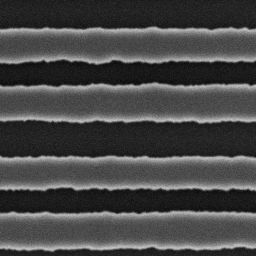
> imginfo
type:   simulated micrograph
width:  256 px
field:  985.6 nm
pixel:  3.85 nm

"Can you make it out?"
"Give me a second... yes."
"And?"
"lines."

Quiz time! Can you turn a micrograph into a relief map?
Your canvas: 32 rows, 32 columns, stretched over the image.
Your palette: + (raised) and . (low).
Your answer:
................................
................................
................................
...........++.....++........+.+.
++++++++++++++++++++++++++++++++
++++++++++++++++++++++++++++++++
++++++++++++++++++++++++++++++++
+++++++.++++++.+++++++++++++++++
................................
................................
..................++............
++++++++++++++++++++++++++++++++
++++++++++++++++++++++++++++++++
++++++++++++++++++++++++++++++++
++++++++++++++++++++++++++++++++
................................
................................
................................
................................
................................
++++++++++++++++++++++++++++++++
++++++++++++++++++++++++++++++++
++++++++++++++++++++++++++++++++
+++++++..+++++++++++++++++++++++
................................
................................
.....................+++........
++++++++++++++++++++++++++++++++
++++++++++++++++++++++++++++++++
++++++++++++++++++++++++++++++++
++++++++++++++++++++++++++++++++
................................